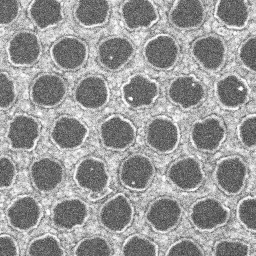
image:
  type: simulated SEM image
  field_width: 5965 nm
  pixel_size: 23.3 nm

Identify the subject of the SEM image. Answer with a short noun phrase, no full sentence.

a regular array of raised bodies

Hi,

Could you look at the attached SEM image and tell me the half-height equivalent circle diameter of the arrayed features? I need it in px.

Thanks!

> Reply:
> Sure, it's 36.2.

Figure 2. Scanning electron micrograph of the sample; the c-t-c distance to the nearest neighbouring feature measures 1040 nanometres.